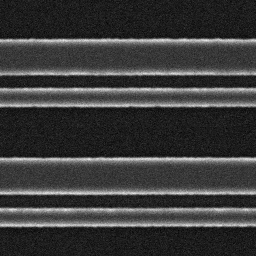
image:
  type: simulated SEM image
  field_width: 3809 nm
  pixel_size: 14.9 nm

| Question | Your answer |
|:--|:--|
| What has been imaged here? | lines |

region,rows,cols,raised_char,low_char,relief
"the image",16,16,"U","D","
DDDDDDDDDDDDDDDD
DDDDDDDDDDDDDDDD
DUUUDUUUUUUUUUUU
UUUUUUUUUUUUUUUU
UUUUUUUUUUUUUUUU
UUUUUUUUUUUUUUUU
UUUUUUUUUUUUUUUU
DDDDDDDDDDDDDDDD
DDDDDDDDDDDDDDDD
DDDDDDDDDDDDDDDD
UUUUUUUUUUUUUUUU
UUUUUUUUUUUUUUUU
UUUUUUUUUUUUUUUU
UUUUUUUUUUUUUUUU
DDDDDDDDDDDDDDDD
DDDDDDDDDDDDDDDD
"